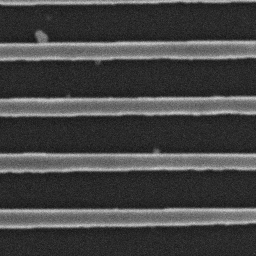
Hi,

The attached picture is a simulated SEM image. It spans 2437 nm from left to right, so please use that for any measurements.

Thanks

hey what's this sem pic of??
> lines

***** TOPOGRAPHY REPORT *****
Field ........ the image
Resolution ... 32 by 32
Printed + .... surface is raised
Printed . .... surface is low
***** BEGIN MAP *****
+++++...........................
................................
................................
................................
................................
.....+++++++++++++++++++++++++++
++++++++++++++++++++++++++++++++
................................
................................
................................
................................
................................
++++++++++++++++++++++++++++++++
++++++++++++++++++++++++++++++++
................................
................................
................................
................................
................................
++++++++++++++++++++++++++++++++
++++++++++++++++++++++++++++++++
................................
................................
................................
................................
................................
++++++++++++++++++++++++++++++++
++++++++++++++++++++++++++++++++
................................
................................
................................
................................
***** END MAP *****